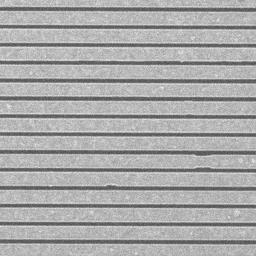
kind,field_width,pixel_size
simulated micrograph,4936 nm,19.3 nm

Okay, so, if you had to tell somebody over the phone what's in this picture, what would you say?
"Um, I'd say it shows parallel lines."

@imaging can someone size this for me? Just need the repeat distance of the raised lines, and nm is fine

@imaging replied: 345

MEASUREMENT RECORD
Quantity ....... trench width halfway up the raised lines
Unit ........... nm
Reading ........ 96.4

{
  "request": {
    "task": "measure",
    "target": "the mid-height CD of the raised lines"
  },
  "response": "0.251 micrometres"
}